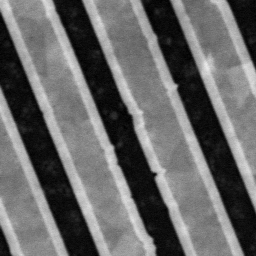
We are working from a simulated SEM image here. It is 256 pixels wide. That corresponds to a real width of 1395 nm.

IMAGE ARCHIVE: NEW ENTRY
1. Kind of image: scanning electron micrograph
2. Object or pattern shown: one or a few lines or trenches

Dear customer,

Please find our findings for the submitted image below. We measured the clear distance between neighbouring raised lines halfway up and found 38.6 px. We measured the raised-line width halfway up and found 231 nm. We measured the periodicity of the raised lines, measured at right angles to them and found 439 nm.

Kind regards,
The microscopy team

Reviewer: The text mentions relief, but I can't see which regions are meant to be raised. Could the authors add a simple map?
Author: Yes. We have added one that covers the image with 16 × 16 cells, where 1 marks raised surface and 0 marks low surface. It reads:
1110001110011100
0111001110001100
0111001110001110
0011000111001110
0011100111000111
0011100011100111
0001110011100011
0001110001100011
1000110001110011
1000111001110001
1100111000111001
1100011100111000
1110011100011000
1110001100011100
0110001110011100
0111001110001110